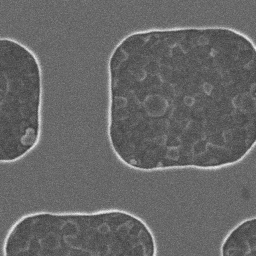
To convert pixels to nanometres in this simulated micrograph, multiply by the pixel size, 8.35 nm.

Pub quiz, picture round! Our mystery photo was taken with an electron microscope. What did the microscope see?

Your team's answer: holes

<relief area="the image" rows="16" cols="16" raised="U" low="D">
UUUUUUUUUUUUUUUU
UUUUUUUUUUUUUUUU
UUUUUUUUDDDDDDDU
DDUUUUUDDDDDDDDD
DDUUUUUDDDDDDDDD
DDUUUUUDDDDDDDDD
DDUUUUUDDDDDDDDD
DDUUUUUDDDDDDDDD
DDUUUUUDDDDDDDDD
DDUUUUUDDDDDDDDU
UUUUUUUUUDUUUUUU
UUUUUUUUUUUUUUUU
UUUUUUUUUUUUUUUU
UUDDDDDDUUUUUUUU
UDDDDDDDDUUUUUUD
DDDDDDDDDDUUUUDD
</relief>